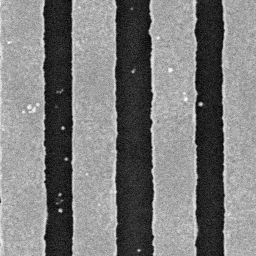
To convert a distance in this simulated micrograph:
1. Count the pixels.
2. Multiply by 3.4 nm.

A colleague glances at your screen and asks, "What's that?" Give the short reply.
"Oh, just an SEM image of lines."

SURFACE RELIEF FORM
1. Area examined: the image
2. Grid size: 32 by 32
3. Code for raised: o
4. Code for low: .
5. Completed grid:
ooooo....ooooo.....ooooo....oooo
ooooo....ooooo.....ooooo....oooo
ooooo....ooooo.....ooooo....oooo
ooooo....ooooo.....ooooo....oooo
ooooo....ooooo.....ooooo....oooo
ooooo....ooooo.....ooooo....oooo
ooooo....ooooo.....ooooo....oooo
ooooo....ooooo.....ooooo....oooo
ooooo....ooooo.....ooooo....oooo
ooooo....ooooo.....ooooo....oooo
oooooo...ooooo.....ooooo....oooo
ooooo....ooooo.....oooooo...oooo
ooooo....ooooo.....ooooo....oooo
ooooo....ooooo.....ooooo....oooo
ooooo....oooooo....ooooo....oooo
ooooo....oooooo....ooooo....oooo
ooooo....oooooo....ooooo....oooo
ooooo....oooooo....ooooo....oooo
oooooo...ooooo.....ooooo....oooo
oooooo...oooooo....ooooo....oooo
oooooo...oooooo....ooooo....oooo
oooooo...ooooo.....oooooo...oooo
oooooo...ooooo.....oooooo...oooo
oooooo...ooooo.....ooooo....oooo
oooooo...ooooo.....ooooo....oooo
oooooo...oooooo....ooooo....oooo
oooooo...oooooo....ooooo....oooo
oooooo...oooooo....ooooo....oooo
oooooo...oooooo....ooooo....oooo
ooooo....ooooo.....ooooo....oooo
oooooo...oooooo....ooooo....oooo
oooooo...oooooo....ooooo....oooo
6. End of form